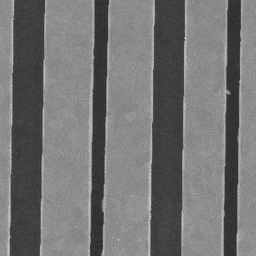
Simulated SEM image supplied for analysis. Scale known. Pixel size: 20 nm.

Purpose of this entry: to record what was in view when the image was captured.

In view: lines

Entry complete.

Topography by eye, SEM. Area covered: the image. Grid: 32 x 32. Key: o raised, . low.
oo....oooooo..ooooo....ooooo..oo
oo....oooooo..ooooo....ooooo..oo
oo....oooooo..ooooo....ooooo..oo
oo....oooooo..ooooo....ooooo..oo
oo....oooooo..ooooo....ooooo..oo
oo....oooooo.oooooo....ooooo..oo
oo....oooooo.oooooo....ooooo..oo
oo....oooooo.oooooo....ooooo..oo
o.....oooooo.oooooo....ooooo..oo
o.....oooooo.oooooo....ooooo..oo
o.....oooooo.oooooo....ooooo..oo
o.....oooooo.oooooo....ooooo..oo
o.....oooooo.oooooo....ooooo..oo
o....oooooo..oooooo....ooooo..oo
o....oooooo..oooooo....ooooo..oo
o....oooooo..oooooo....ooooo..oo
o....oooooo..oooooo....ooooo..oo
o....oooooo..oooooo....ooooo..oo
o....oooooo..oooooo....ooooo..oo
o....oooooo..oooooo....ooooo..oo
o....oooooo..oooooo....ooooo..oo
o....oooooo..oooooo....ooooo..oo
o....oooooo..oooooo....ooooo..oo
o....oooooo..oooooo....ooooo..oo
o....oooooo..oooooo....ooooo..oo
o....oooooo..oooooo....ooooo..oo
o....oooooo..oooooo....ooooo..oo
o....oooooo..oooooo....ooooo..oo
o....oooooo..oooooo....ooooo..oo
o....oooooo..oooooo....ooooo..oo
o....oooooo..oooooo....ooooo..oo
o....oooooo..oooooo....ooooo..oo